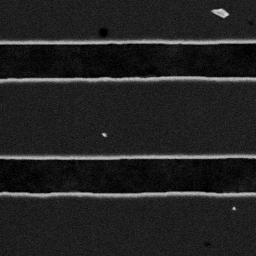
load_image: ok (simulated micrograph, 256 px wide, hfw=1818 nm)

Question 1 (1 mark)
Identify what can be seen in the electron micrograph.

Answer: lines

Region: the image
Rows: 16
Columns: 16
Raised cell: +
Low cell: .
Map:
++++++++++++++++
++++++++++++++++
++++++++++++++++
................
................
++++++++++++++++
++++++++++++++++
++++++++++++++++
++++++++++++++++
++++++++++++++++
................
................
++++++++++++++++
++++++++++++++++
++++++++++++++++
++++++++++++++++